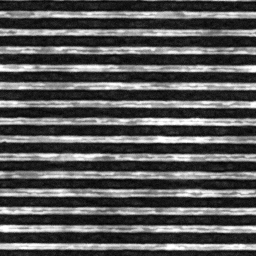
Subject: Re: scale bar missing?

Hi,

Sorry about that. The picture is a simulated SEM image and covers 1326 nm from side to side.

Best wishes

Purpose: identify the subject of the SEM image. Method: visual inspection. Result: parallel lines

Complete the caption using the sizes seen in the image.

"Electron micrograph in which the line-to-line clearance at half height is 60.2 nm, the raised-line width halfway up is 6.24 pixels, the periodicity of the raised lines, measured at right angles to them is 92.4 nm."